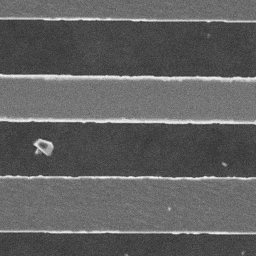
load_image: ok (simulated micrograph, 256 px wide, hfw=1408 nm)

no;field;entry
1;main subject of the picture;lines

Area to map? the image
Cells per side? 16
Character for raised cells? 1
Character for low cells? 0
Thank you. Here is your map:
1111111111111111
0000000000000000
0000000000000000
0000000000000000
0000000000000000
1111111111111111
1111111111111111
1111111111111111
0000000000000000
0000000000000000
0000000000000000
1111111111111111
1111111111111111
1111111111111111
0001111111111111
0000000000000000